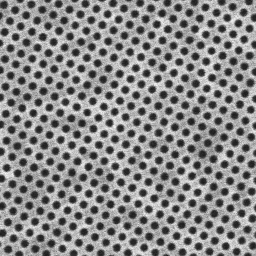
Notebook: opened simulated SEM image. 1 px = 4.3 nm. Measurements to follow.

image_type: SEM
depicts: a regular array of holes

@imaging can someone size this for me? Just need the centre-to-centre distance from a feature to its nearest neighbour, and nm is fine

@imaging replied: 51.5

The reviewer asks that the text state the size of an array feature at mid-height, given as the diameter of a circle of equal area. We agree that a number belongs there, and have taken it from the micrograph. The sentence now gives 35.7 nm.